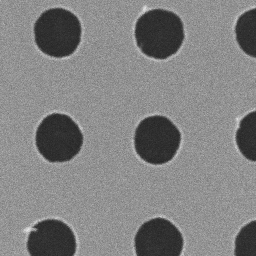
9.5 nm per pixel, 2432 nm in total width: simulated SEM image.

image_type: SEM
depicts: holes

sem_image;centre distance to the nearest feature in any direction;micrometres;0.95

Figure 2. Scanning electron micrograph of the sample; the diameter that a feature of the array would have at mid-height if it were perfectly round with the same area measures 467 nm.